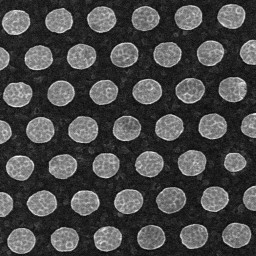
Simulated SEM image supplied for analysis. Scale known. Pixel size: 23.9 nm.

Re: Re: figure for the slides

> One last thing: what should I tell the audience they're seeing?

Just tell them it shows a regular array of raised bodies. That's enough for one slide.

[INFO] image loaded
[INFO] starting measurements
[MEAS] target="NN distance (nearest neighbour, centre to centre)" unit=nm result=1010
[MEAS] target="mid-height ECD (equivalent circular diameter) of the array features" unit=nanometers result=623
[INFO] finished